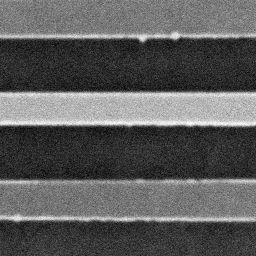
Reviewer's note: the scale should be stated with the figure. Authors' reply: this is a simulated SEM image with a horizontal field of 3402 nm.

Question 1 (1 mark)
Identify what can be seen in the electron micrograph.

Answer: lines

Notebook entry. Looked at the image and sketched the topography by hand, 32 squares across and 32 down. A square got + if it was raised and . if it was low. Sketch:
++++++++++++++++++++++++++++++++
++++++++++++++++++++++++++++++++
++++++++++++++++++++++++++++++++
++++++++++++++++++++++++++++++++
++++++++++++++++++++++++++++++++
................................
................................
................................
................................
................................
................................
................................
++++++++++++++++++++++++++++++++
++++++++++++++++++++++++++++++++
++++++++++++++++++++++++++++++++
++++++++++++++++++++++++++++++++
................................
................................
................................
................................
................................
................................
................................
++++++++++++++++++++++++++++++++
++++++++++++++++++++++++++++++++
++++++++++++++++++++++++++++++++
++++++++++++++++++++++++++++++++
..+.......++..+++.++++++++++++++
................................
................................
................................
................................